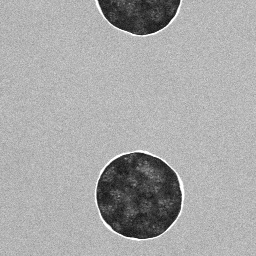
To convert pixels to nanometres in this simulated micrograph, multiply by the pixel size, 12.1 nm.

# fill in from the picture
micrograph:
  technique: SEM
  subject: holes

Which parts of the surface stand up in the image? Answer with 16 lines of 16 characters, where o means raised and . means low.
oooooo.....ooooo
ooooooo...oooooo
oooooooooooooooo
oooooooooooooooo
oooooooooooooooo
oooooooooooooooo
oooooooooooooooo
oooooooooooooooo
oooooooooooooooo
oooooooooooooooo
ooooooo....ooooo
oooooo.....ooooo
oooooo.....ooooo
oooooo.....ooooo
ooooooo...oooooo
oooooooooooooooo